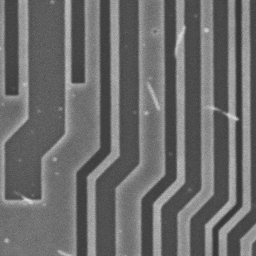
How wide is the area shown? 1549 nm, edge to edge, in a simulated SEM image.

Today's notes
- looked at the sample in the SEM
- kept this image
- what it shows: groups of lines, slits or small figures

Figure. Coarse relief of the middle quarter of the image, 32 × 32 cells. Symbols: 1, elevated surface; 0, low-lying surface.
11000111100011000001111110001100
11000111100011000001111110001100
11000111100011000001111110001100
11000111100011000001111110001100
11000111100011000001111110001100
11111111100011000001111110001100
11111111100011000001111110001100
11111111100011000001111110001100
11111111100011000001111110001100
11111111100011000001111110001100
11111111100011000001111110001100
11111111100011000001111110001100
11111111100011000001111110001100
11111111100011000001111110001100
11111111100011000001111110001100
11111111100011000001111110001100
11111111100011000001111110001100
11111111100011000001111110001100
11111111100011000001111110001100
11111111100011000001111110001100
11111111100011000001111110001100
11111111100011000001111110001100
11111111000111000001111110001100
11111110000110000001111110001100
11111100001100000001111110001100
11111000011000000011111110001100
11110000110000000011111110001100
11100011100000000111111110001100
11100011000000001111111100001100
11100011000000011111111000001100
11100011000000111111110000011000
11100011000001111111100000111000